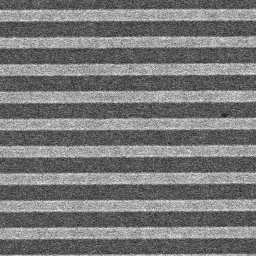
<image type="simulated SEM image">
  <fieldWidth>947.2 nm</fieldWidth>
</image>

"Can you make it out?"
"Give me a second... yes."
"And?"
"parallel lines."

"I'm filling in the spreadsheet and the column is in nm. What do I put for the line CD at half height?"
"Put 37.9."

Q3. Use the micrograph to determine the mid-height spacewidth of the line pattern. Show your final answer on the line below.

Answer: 0.0628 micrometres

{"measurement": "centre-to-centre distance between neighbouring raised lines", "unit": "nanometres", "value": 101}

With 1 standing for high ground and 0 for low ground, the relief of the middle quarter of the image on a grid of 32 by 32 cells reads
11111111111111111111111111111111
11111111111111111111111111111111
11111111111111111111111111111111
00000000000000000000000000000000
00000000000000000000000000000000
00000000000000000000000000000000
00000000000000000000000000000000
11111111111111111111111111111111
11111111111111111111111111111111
00000000000000000000000000000000
00000000000000000000000000000000
00000000000000000000000000000000
00000000000000000000000000000000
00000000000000000000000000000000
11111111111111111111111111111111
11111111111111111111111111111111
00000000000000000000000000000000
00000000000000000000000000000000
00000000000000000000000000000000
00000000000000000000000000000000
00000000000000000000000000000000
11111111111111111111111111111111
11111111111111111111111111111111
00000000000000000000000000000000
00000000000000000000000000000000
00000000000000000000000000000000
00000000000000000000000000000000
00000000000000001111111111111111
11111111111111111111111111111111
11111111111111111111111111111111
00000000000000000000000000000000
00000000000000000000000000000000